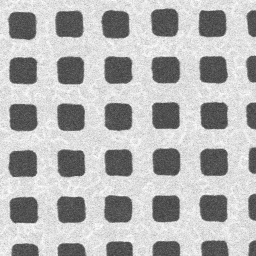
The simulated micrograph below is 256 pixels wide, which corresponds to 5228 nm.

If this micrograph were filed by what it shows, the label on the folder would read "a regular array of holes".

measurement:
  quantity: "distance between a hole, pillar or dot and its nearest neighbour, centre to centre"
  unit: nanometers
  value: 939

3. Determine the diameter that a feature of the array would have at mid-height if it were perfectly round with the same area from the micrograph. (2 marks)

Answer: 0.617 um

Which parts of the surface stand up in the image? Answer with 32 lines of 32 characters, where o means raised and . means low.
oooooooooooooooooooooooooooooooo
oo..ooo...ooo...ooo...ooo...ooo.
o...ooo...ooo...ooo...ooo...ooo.
o....oo...ooo...ooo...ooo...ooo.
o...ooo...ooo...oooo..ooo...ooo.
oooooooooooooooooooooooooooooooo
oooooooooooooooooooooooooooooooo
o...ooo...ooo...ooo...ooo...ooo.
o....oo....oo....oo...ooo...ooo.
o....oo....oo....oo...ooo...ooo.
ooo.oooo..oooo.ooooo.ooooooooooo
oooooooooooooooooooooooooooooooo
oooooooooooooooooooooooooooooooo
o...ooo...ooo...ooo...ooo...ooo.
o....oo....oo....oo....oo...ooo.
o....oo....oo....oo...ooo...ooo.
oooooooooooooooooooooooooooooooo
oooooooooooooooooooooooooooooooo
oooooooooooooooooooooooooo.ooooo
o....oo...ooo....oo...ooo...ooo.
o....oo....oo....oo....oo....oo.
o....oo....oo....oo...ooo...ooo.
oooooooooooooooooooooooooooooooo
oooooooooooooooooooooooooooooooo
oooooooo.oooo..oooo...ooo...ooo.
o....oo....oo....oo....oo...ooo.
o....oo....oo....oo...ooo...ooo.
o....oo...ooo...ooo...ooo...oooo
oooooooooooooooooooooooooooooooo
oooooooooooooooooooooooooooooooo
oo..oooo..ooo...ooo...ooo...ooo.
o....oo....oo....oo....oo....oo.